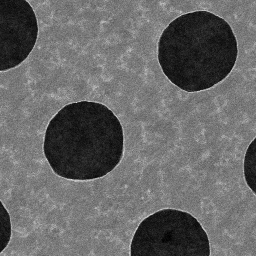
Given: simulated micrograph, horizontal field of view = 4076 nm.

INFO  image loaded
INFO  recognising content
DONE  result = holes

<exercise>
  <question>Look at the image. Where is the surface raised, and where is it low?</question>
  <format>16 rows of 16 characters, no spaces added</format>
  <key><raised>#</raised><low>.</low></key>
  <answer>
..##############
..#########...##
..########.....#
..########.....#
##########....##
###########..###
####..##########
###....#########
###.....########
###.....#######.
###....########.
################
################
.########...####
.#######.....###
########.....###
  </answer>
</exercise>